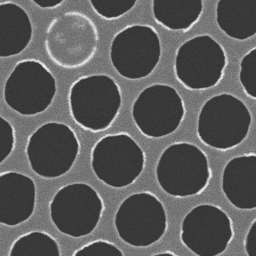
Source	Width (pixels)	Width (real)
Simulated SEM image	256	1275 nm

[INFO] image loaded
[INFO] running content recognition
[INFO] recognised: a regular array of holes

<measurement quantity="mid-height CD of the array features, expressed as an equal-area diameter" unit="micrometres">0.256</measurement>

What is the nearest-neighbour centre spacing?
316 nm